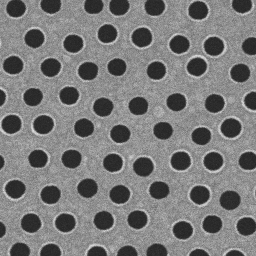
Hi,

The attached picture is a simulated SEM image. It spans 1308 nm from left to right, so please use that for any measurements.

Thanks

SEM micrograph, a regular array of holes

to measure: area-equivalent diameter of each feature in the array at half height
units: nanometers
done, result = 99.8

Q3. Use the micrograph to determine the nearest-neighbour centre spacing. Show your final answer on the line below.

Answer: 0.157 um